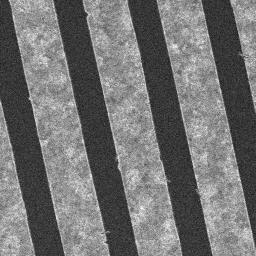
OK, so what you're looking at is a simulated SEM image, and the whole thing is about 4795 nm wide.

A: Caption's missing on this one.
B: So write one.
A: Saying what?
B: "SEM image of one or a few lines or trenches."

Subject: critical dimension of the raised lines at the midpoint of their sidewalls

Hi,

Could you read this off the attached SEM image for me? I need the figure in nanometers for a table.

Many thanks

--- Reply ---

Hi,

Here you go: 808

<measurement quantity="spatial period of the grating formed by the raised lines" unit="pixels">72.1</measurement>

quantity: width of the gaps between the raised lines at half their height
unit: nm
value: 549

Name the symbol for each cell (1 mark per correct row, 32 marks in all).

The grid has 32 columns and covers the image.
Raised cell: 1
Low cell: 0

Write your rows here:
01111110001111110000111110000111
00111110000111110000111110000111
00111110000111110000111111000111
00111110000111111000111111000011
00111111000111111000011111000011
00111111000011111000011111000011
00011111000011111000011111100011
00011111000011111100011111100001
00011111000011111100011111100001
00011111100011111100001111100001
00011111100001111100001111100001
00001111100001111100001111110001
00001111100001111110001111110000
00001111110001111110000111110000
10001111110000111110000111110000
10000111110000111110000111111000
10000111110000111110000111111000
10000111110000111111000111111000
10000111111000011111000011111000
11000111111000011111000011111000
11000011111000011111000011111100
11000011111000011111000011111100
11000011111100011111100001111100
11000011111100001111100001111100
11100011111100001111100001111100
11100001111100001111100001111110
11100001111110001111110001111110
11100001111110001111110000111110
11110001111110000111110000111110
11110000111110000111110000111110
11110000111110000111110000111111
11110000111111000111111000011111